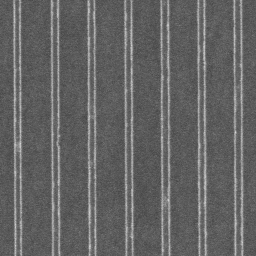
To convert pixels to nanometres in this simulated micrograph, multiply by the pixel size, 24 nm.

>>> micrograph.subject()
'parallel lines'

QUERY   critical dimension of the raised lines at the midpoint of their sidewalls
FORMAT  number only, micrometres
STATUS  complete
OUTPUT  0.156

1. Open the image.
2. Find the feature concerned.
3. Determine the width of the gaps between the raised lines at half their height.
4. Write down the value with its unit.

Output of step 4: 0.736 microns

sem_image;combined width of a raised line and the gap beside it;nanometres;883